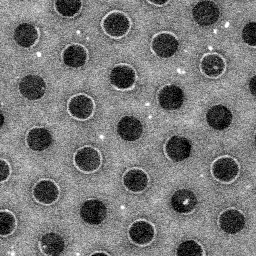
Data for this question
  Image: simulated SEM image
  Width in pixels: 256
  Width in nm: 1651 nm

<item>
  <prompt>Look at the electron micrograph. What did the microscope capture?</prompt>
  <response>a regular array of raised bodies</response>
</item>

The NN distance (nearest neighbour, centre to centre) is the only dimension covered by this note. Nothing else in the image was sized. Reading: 51.9 pixels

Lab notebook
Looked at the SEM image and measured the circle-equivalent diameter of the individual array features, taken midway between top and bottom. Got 0.178 µm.